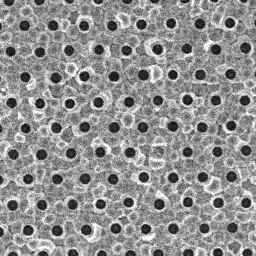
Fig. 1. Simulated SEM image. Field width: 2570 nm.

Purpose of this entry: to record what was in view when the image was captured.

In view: a regular array of holes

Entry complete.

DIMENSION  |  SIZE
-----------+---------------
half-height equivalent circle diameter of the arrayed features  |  112 nm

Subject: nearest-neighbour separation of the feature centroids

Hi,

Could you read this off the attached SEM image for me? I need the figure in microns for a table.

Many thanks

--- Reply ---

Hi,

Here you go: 0.279